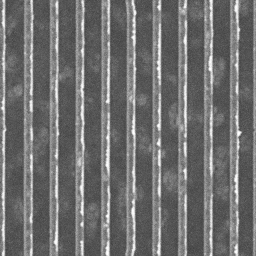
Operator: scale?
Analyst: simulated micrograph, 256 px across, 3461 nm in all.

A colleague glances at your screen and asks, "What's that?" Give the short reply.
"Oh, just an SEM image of parallel lines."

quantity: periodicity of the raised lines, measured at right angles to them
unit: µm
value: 0.348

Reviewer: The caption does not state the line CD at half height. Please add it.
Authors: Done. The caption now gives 101 nanometres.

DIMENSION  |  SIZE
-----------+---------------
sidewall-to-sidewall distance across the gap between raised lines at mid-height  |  248 nanometers